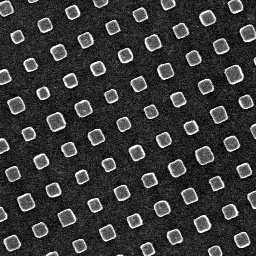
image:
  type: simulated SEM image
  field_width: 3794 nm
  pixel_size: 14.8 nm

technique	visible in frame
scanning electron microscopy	a regular array of raised bodies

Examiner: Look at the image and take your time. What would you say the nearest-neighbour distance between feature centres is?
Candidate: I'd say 443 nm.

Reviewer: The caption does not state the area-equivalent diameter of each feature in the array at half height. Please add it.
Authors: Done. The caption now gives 216 nm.